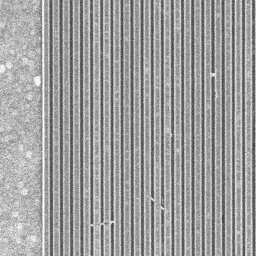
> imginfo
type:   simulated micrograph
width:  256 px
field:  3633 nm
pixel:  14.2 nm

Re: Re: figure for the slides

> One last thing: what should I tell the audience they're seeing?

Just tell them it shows parallel lines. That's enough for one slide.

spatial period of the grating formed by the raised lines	144	nm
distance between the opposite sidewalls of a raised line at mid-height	85.1	nanometres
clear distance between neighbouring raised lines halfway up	60.3	nm